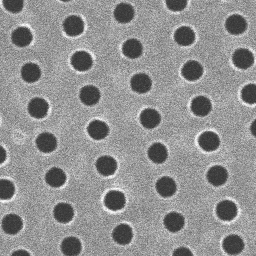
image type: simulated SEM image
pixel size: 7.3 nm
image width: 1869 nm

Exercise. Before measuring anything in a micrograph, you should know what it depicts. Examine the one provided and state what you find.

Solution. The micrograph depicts a regular array of holes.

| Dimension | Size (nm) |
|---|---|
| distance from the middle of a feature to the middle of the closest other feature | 258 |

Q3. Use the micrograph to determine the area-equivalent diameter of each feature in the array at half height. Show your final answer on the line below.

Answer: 153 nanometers